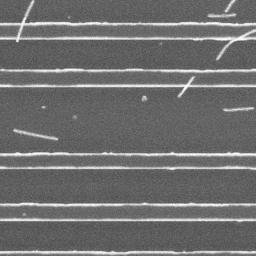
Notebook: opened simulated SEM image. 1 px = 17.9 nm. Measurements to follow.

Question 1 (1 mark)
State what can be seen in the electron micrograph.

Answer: lines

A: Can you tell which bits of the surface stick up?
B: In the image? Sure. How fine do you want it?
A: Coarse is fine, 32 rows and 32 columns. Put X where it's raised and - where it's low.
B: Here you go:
--------------------------------
--------------------------------
--------------------------------
XXXXXXXXXXXXXXXXXXXXXXXXXXXXXXXX
XXXXXXXXXXXXXXXXXXXXXXXXXXXXXXXX
--------------------------------
--------------------------------
--------------------------------
--------------------------------
XXXXXXXXXXXXXXXXXXXXXXXXXXXXXXXX
XXXXXXXXXXXXXXXXXXXXXXXXXXXXXXXX
--------------------------------
--------------------------------
--------------------------------
--------------------------------
--------------------------------
--------------------------------
--------------------------------
--------------------------------
XXXXXXXXXXXXXXXXXXXXXXXXXXXXXXXX
XXXXXXXXXXXXXXXXXXXXXXXXXXXXXXXX
--------------------------------
--------------------------------
--------------------------------
--------------------------------
--XXX-------------X-------------
XXXXXXXXXXXXXXXXXXXXXXXXXXXXXXXX
XXXXXXXXXXXXXXXXXXXXXXXXXXXXXXXX
--------------------------------
--------------------------------
--------------------------------
XXXXXXXXXXXXX---XXXXXXX-XXXXXXXX